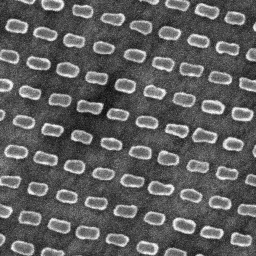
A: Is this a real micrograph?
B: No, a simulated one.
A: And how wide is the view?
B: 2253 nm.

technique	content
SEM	a regular array of raised bodies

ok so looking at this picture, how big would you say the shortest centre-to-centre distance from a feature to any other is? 260 nm